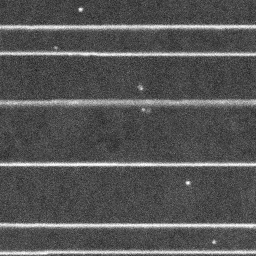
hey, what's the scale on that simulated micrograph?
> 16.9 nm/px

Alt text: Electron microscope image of lines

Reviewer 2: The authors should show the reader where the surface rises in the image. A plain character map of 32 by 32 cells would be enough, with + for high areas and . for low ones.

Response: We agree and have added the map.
................................
................................
................................
++++++++++++++++++++++++++++++++
++++++++++++++++++++++++++++++++
++++++++++++++++++++++++++++++++
++++++++++++++++++++++++++++++++
................................
................................
................................
................................
................................
................................
++++++++++++++++++++++++++++++++
++++++++++++++++++++++++++++++++
++++++++++++++++++++++++++++++++
++++++++++++++++++++++++++++++++
++++++++++++++++++++++++++++++++
++++++++++++++++++++++++++++++++
++++++++++++++++++++++++++++++++
++++++++++++++++++++++++++++++++
................................
................................
................................
................................
................................
................................
................................
++++++++++++++++++++++++++++++++
++++++++++++++++++++++++++++++++
++++++++++++++++++++++++++++++++
++++++++++++++++++++++++++++++++